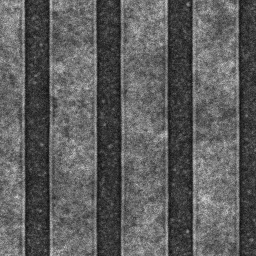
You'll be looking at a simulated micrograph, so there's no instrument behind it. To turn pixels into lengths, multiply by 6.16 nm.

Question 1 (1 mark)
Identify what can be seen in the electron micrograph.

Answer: one or a few lines or trenches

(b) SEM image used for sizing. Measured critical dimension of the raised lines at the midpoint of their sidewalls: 0.271 micrometres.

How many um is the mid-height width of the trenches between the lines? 0.171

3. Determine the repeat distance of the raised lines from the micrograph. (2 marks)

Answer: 0.439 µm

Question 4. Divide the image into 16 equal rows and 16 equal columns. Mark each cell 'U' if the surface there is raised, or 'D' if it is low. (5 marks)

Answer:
UDDUUUDDUUDDUUUD
UDDUUUDDUUDDUUUD
UDDUUUDDUUDDUUUD
UDDUUUDDUUDDUUUD
UDDUUUDDUUDDUUUD
UDDUUUDDUUDDUUUD
UDDUUUDDUUDDUUUD
UDDUUUDDUUDDUUUD
UDDUUUDDUUDDUUUD
UDDUUUDDUUDDUUUD
UDDUUUDDUUDDUUUD
UDDUUUDDUUDDUUUD
UDDUUUDDUUDDUUUD
UDDUUUDDUUDDUUUD
UDDUUUDDUUDDUUUD
UDDUUUDDUUDDUUUD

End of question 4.